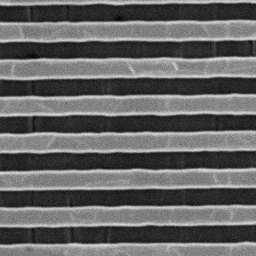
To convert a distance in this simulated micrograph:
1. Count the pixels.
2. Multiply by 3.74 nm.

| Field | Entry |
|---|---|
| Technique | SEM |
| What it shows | wiring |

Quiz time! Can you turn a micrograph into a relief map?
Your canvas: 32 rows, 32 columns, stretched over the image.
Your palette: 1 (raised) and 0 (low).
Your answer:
11110000000000000000000000000000
00000000000000000000000000000000
00000000000000000000000000000000
11111111111111111111111111111111
11111111111111111111111111111111
00000000000000000000000000000000
00000000000000000000000000000000
00000000000000000001111000111111
11111111111111111111111111111111
11111111111111111101111111100000
00000000000000000000000000000000
00000000000000000000000000000000
11111111111111111111111111111111
11111111111111111111111111111111
00000000000000000000000000000000
00000000000000000000000000000000
00000000000000000000000000000011
11111111111111111111111111111111
11111111111111111111111111111111
00000000000000000000000000000000
00000000000000000000000000000000
00001111111111111111111111111111
11111111111111111111111111111111
11111111111111100000000000000000
00000000000000000000000000000000
00000000000000000000000000000000
11111111111111111111111111111111
11111111111111111111111111111111
00000000000000000000000000000000
00000000000000000000000000000000
00000000000000000000000000000011
11111111111111111111111111111111